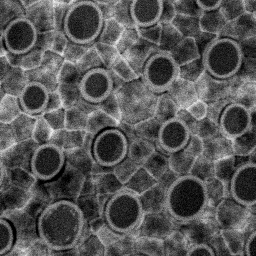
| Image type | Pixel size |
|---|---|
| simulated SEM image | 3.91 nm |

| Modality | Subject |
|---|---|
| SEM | a regular array of raised bodies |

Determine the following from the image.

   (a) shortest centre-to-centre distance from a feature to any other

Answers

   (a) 249 nm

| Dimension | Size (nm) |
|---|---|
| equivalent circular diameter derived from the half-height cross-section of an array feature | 123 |